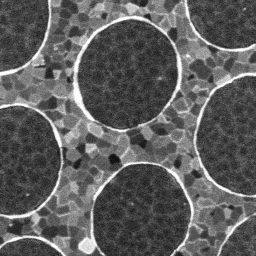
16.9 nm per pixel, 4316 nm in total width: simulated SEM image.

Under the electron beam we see holes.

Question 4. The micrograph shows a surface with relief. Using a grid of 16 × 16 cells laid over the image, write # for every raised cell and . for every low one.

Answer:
...#########....
...####..###....
...###.....##...
..###......#####
#####......#####
#####......###..
#####.....###...
...###...###....
...#########....
....########....
....####..###...
....###....###..
...###......####
######......####
######......###.
...###.....###..